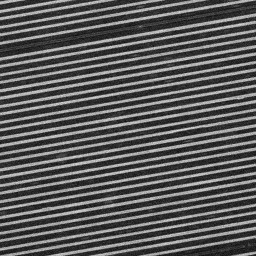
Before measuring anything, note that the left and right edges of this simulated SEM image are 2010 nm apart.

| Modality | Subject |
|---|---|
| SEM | parallel lines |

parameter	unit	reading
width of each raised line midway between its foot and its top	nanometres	14.5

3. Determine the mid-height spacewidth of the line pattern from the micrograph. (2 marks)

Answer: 43.5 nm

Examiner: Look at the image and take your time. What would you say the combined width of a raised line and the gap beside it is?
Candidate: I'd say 61.3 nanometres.